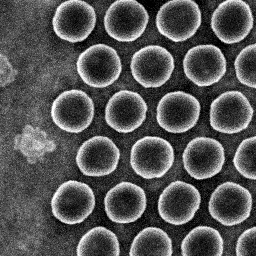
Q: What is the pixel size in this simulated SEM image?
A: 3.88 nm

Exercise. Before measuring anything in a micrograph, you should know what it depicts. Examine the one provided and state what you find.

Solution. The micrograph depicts a regular array of raised bodies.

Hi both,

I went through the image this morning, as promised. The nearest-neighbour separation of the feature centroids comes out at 202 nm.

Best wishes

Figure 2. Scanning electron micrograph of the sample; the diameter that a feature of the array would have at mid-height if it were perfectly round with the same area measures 0.161 um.